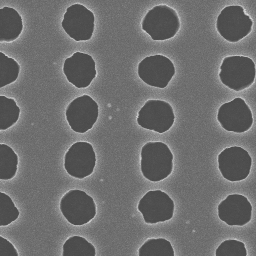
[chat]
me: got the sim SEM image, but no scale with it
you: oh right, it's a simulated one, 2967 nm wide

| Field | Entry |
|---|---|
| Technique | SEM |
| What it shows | a regular array of holes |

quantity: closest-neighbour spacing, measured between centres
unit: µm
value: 0.528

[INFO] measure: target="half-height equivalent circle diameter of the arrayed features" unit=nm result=395